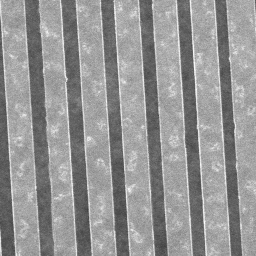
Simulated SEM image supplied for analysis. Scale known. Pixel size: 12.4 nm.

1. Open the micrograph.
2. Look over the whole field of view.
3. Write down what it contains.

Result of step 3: parallel lines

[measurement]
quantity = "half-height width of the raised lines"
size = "0.293 µm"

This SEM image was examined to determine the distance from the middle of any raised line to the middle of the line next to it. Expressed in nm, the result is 473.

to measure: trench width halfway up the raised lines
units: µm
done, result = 0.18